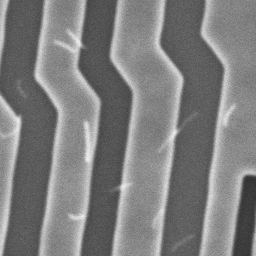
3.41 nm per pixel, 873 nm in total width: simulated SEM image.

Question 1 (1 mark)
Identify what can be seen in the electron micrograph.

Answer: groups of lines, slits or small figures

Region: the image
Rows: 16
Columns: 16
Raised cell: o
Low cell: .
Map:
...oo..ooo...ooo
...oo..ooo...ooo
..ooo..ooo...ooo
..ooo..ooo....oo
..ooo..oooo...oo
...ooo..ooo...oo
...ooo..ooo...oo
o...oo..ooo...oo
o..ooo..ooo..ooo
o..ooo..ooo..ooo
o..ooo..ooo..ooo
o..ooo..ooo..oo.
o..ooo.ooo...oo.
o..oo..ooo...oo.
...oo..ooo...oo.
...oo..ooo...oo.